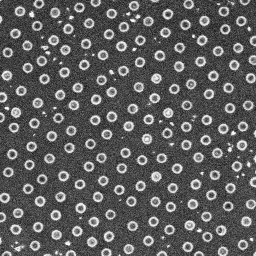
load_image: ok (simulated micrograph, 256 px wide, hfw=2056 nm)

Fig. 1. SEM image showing a regular array of raised bodies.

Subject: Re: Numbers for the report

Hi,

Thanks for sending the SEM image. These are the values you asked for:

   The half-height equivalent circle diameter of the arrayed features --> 72.2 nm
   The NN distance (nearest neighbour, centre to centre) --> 18.4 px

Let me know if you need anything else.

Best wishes